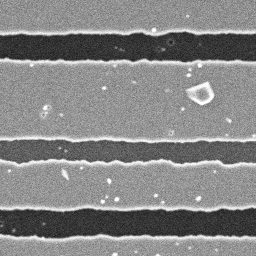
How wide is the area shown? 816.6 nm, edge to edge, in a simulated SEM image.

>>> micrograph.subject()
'lines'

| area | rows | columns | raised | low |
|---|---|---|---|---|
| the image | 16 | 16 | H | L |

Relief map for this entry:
HHHHHHHHHHHHHHHH
HHHHHHHHHHHHHHHH
LLLLLLLLLLLLLLLL
LLLLLLLLLLLLLLLL
HHHHHHHHHHHHHHHH
HHHHHHHHHHHHHHHH
HHHHHHHHHHHHHHHH
HHHHHHHHHHHHHHHH
HHHHHHHHHHHHHHHH
HHHHHHHHHHHHHHHH
HHHHHHHHHHHHHHHH
HHHHHHHHHHHHHHHH
HHHHHHHHHHHHHHHH
LLLLLLLLLLLLLLLL
LLLLLLLLLLLLLLLL
HHHHHHHHHHHHHHHH